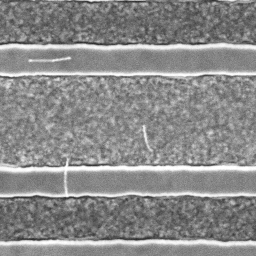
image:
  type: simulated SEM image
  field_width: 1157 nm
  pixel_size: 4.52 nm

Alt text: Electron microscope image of lines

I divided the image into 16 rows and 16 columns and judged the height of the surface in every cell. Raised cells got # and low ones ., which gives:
................
................
................
################
################
................
................
................
................
................
################
################
................
................
................
################